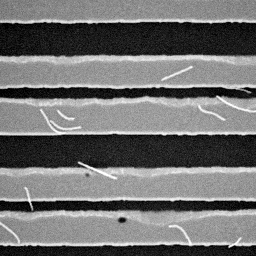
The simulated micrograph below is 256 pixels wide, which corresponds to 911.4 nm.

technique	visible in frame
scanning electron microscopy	lines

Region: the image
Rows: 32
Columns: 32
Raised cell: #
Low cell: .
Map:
################################
################################
################################
................................
................................
................................
................................
########.####################...
################################
################################
################################
................................
##.............#.###.......#....
################################
################################
################################
################################
................................
................................
................................
................................
##################.#############
################################
################################
################################
................................
...............................#
################################
################################
################################
################################
................................